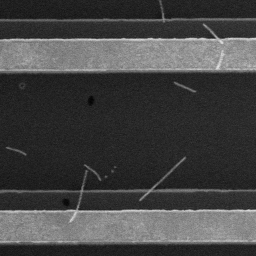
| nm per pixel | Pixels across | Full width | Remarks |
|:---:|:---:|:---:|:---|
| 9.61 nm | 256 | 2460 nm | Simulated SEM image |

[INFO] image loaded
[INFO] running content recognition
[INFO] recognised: lines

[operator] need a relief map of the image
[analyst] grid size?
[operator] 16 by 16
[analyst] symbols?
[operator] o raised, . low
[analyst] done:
................
oooooooooooooooo
oooooooooooooooo
oooooooooooooooo
................
................
................
................
................
................
................
................
oooooooooooooooo
oooooooooooooooo
oooooooooooooooo
................